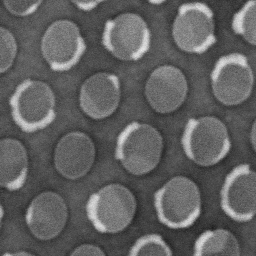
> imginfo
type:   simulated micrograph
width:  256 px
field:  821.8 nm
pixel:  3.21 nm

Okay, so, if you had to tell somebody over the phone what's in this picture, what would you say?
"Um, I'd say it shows a regular array of raised bodies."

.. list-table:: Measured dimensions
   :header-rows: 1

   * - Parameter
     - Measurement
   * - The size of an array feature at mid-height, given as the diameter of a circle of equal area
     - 148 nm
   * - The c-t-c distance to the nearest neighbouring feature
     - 64.6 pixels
